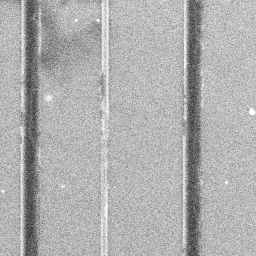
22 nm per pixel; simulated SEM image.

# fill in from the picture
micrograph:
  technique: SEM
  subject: lines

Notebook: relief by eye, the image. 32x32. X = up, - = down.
---XX------------------XX-------
---XX------------------XX-------
---XX------------------XX-------
---XX------------------XX-------
---XX------------------XX-------
---XX------------------XX-------
---XX------------------XX-------
---XX------------------XX-------
---XX------------------XX-------
---XX------------------XX-------
---XX-------X----------XX-------
---XX-------X----------XX-------
---XX------------------XX-------
---XX------------------XX-------
---XX------------------XX-------
---XX------------------XX-------
---XX------------------XX-------
---XX------------------XX-------
---XX------------------XX-------
---XX------------------XX-------
---XX------------------XX-------
---XX------------------XX-------
---XX------------------XX-------
---XX------------------XX-------
---XX------------------XX-------
---XX------------------XX-------
---XX------------------XX-------
---XX------------------XX-------
---XX------------------XX-------
---XX------------------XX-------
---XX------------------XX-------
---XX------------------XX-------